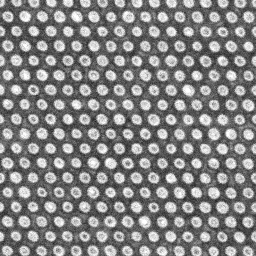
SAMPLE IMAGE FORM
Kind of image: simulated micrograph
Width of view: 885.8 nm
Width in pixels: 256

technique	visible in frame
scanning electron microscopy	a regular array of raised bodies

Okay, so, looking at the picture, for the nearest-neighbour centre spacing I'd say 0.058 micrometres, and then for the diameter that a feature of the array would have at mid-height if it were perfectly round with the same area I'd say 30.5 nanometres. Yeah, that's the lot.